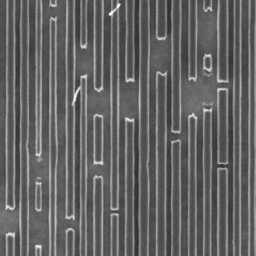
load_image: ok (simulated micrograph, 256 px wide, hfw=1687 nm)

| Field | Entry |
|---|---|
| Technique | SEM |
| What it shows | parallel lines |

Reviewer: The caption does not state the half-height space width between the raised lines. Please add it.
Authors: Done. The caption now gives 46.1 nanometres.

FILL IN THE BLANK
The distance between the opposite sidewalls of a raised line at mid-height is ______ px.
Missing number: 8.76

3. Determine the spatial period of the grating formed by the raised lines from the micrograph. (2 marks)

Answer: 99.6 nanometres